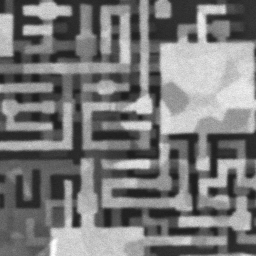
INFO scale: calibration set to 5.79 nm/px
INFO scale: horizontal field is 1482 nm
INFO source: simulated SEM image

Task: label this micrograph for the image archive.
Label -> wiring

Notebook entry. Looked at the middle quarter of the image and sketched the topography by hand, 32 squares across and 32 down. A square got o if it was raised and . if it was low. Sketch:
oooooooooooooooooooooooooooooooo
oooooooooooooooooooooooooooooooo
oo..ooo..ooo..ooo..oo...oooooooo
oo..ooo...o...oo...oo...oooooooo
oo..ooo..ooo..oo...oo...oooooooo
oo..oooooooooooo...oo...oooooooo
oo..oooooooooooo...oo...oooooooo
oo..ooo..ooo.......oo...oooooooo
oo..ooo...o........oo...oooooooo
ooo.ooo..ooo.oooo.oooo..oooooooo
ooo.oooooooooooooooooo..oooooooo
ooo.oooooo...oooo.oooo.ooooooooo
ooo..oo................ooooooooo
oo...oo................ooooooooo
oo...oooooooooooooooo..ooooooooo
oo...ooooooooooooooooo..oooooooo
oo...ooooooooooo.oooo...oooooooo
oo...oo............oo...oo......
oo...oo............oo...oo......
oo...oooooooooooooooo...ooooooo.
oo...oooooooooooooooo...ooooooo.
........................oo...oo.
........................oo...oo.
........................oo...oo.
oo..ooo..oooooooooooooooooooooo.
oo..ooo...ooooooooooooooooooooo.
....ooo...oo............oo...oo.
....ooo...oo............oo...oo.
....ooo...oo...........oooo..oo.
oo..ooo...ooooooooooooooooooooo.
oo..ooo...ooooooooooooooooooooo.
oo..ooo...oo............oo...oo.